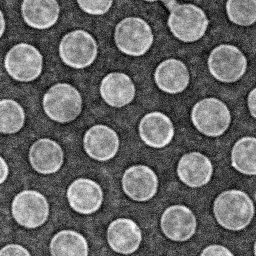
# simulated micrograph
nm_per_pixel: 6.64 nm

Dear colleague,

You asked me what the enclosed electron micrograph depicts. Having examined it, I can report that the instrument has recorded a regular array of raised bodies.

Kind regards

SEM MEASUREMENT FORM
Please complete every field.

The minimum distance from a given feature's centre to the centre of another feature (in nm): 368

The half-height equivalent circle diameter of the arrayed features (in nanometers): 226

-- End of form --